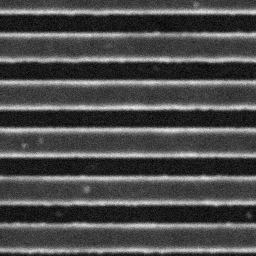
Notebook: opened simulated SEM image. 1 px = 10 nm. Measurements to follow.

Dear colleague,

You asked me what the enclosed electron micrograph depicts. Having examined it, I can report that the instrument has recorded lines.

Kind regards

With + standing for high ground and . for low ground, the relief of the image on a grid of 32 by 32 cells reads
++++++++++++++++++++++++++++++++
++++++++++++++++++++++++++++++++
................................
................................
++++++++++++++++++++++++++++++++
++++++++++++++++++++++++++++++++
++++++++++++++++++++++++++++++++
++++++++++++++++++++++++++++++++
................................
................................
++++++++++++++++++++++++++++++++
++++++++++++++++++++++++++++++++
++++++++++++++++++++++++++++++++
++++++++++++++++++++++++++++++++
................................
................................
++++++++++++++++++++++++++++++++
++++++++++++++++++++++++++++++++
++++++++++++++++++++++++++++++++
++++++++++++++++++++++++++++++++
................................
................................
++++++++++++++++++++++++++++++++
++++++++++++++++++++++++++++++++
++++++++++++++++++++++++++++++++
................................
................................
................................
++++++++++++++++++++++++++++++++
++++++++++++++++++++++++++++++++
++++++++++++++++++++++++++++++++
...+...+.+........+.+...........